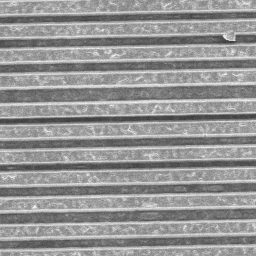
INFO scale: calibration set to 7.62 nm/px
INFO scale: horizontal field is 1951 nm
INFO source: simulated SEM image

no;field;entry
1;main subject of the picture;parallel lines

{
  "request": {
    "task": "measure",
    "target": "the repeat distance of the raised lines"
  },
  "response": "191 nanometers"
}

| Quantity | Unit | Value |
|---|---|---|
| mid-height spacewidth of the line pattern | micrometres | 0.08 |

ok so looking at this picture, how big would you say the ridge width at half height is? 14.3 pixels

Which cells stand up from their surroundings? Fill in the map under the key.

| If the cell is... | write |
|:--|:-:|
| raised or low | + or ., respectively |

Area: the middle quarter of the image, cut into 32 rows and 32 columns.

................................
................................
++++++++++++++++++++++++++++++++
++++++++++++++++++++++++++++++++
++++++++++++++++++++++++++++++++
+++++.+++++++..+................
................................
................................
................................
..................++++++++++++++
++++++++++++++++++++++++++++++++
++++++++++++++++++++++++++++++++
++++++++++++++++++++++++++++++++
................................
.............................+++
++++++++++++++++++++++++++++++++
++++++++++++++++++++++++++++++++
++++++++++++++++++++++++++++++++
....+...........................
................................
................................
++++++++++++++++++++++++++++++++
++++++++++++++++++++++++++++++++
++++++++++++++++++++++++++++++++
+++.............................
................................
.....................+++++++++++
++++++++++++++++++++++++++++++++
++++++++++++++++++++++++++++++++
++++++++++++++++++++++++++++++++
................................
................................